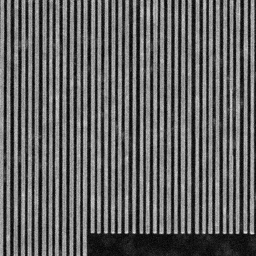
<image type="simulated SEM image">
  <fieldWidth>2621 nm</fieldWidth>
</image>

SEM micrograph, parallel lines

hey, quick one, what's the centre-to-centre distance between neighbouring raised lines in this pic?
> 0.0712 microns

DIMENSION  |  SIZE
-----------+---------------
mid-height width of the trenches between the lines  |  41 nanometres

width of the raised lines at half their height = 28.2 nm